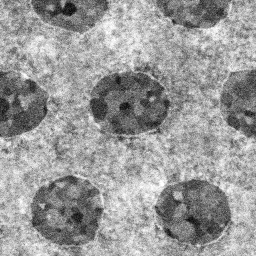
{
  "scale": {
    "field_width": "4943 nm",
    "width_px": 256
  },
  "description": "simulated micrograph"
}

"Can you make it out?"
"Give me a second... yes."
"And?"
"raised bodies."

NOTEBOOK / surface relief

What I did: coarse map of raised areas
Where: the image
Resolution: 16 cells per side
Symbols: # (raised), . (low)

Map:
..#####...####..
...###.....###..
................
................
#......##......#
###...####....##
###...#####...##
###...####....##
#.......#......#
................
................
...###.....##...
..####....####..
..####....####..
..####....####..
................